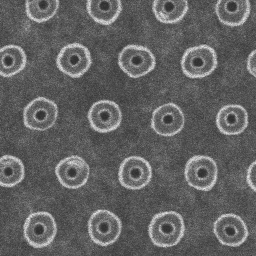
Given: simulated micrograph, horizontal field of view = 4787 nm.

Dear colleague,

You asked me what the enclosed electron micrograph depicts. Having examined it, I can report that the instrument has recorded a regular array of ring-shaped raised bodies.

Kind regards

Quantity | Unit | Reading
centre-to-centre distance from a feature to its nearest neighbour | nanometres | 1170